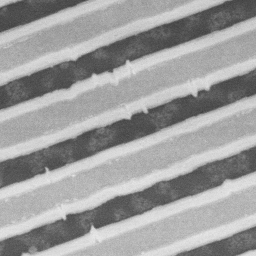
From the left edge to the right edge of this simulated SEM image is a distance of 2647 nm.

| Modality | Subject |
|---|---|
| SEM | one or a few lines or trenches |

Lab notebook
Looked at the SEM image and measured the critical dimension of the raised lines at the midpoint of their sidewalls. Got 378 nanometers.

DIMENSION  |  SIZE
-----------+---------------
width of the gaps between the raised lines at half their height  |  378 nm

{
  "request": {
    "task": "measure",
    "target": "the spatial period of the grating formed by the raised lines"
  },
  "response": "756 nm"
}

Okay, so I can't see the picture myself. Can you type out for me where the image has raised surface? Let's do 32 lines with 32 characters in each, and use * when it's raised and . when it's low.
............*************.......
.........**************.........
.......*************............
....************..............**
.*************..............****
************.............*******
*********.............**********
******.............*************
***..............*************..
*..............************.....
...........**************.......
.........*************..........
......*************.............
...*************.............***
.*************.............*****
***********.............********
*********.............**********
******.............************.
***.............*************...
.............*************......
...........*************........
........**************..........
......*************.............
...*************.............***
*************..............*****
***********............*********
********.............***********
*****.............**************
**.............**************...
............**************......
..........*************.........
.......*************............